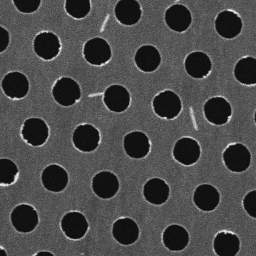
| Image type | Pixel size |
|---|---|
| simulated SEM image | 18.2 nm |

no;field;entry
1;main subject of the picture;a regular array of holes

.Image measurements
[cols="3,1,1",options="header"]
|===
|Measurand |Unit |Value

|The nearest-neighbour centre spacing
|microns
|0.916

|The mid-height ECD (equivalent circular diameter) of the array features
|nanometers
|494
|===